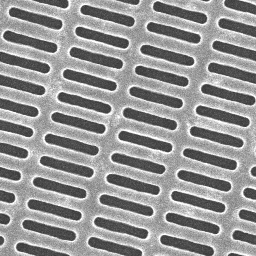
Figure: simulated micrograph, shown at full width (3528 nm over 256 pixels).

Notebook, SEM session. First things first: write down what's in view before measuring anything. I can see a regular array of holes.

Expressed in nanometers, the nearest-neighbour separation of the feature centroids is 303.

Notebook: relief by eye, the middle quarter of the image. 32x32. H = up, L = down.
HHHHHHHHHHLLLLLHHHHHHHHHHHHHHHHH
LLHHHHHHHHHHHHHHHHLLLLLLHHHHHHHH
LLLLLLHHHHHHHHHHHHLLLLLLLLLHHHHH
LLLLLLLLLHHHHHHHHHHHHLLLLLLLLLLH
HHHLLLLLLLLLLHHHHHHHHHHHHLLLLLLH
HHHHHHHLLLLLLHHHHHHHHHHHHHHHHLHH
HHHHHHHHHHHLLHHHLLLLLHHHHHHHHHHH
LHHHHHHHHHHHHHHHLLLLLLLLLHHHHHHH
LLLLLHHHHHHHHHHHHHLLLLLLLLLLLHHH
LLLLLLLLLHHHHHHHHHHHHHLLLLLLLLHH
HHHLLLLLLLLLHHHHHHHHHHHHHHLLLLHH
HHHHHHHLLLLLHHHLLLHHHHHHHHHHHHHH
HHHHHHHHHHHHHHHLLLLLLLHHHHHHHHHH
LLLLHHHHHHHHHHHLLLLLLLLLLLHHHHHH
LLLLLLLLHHHHHHHHHHHLLLLLLLLLHHHH
HHLLLLLLLLHHHHHHHHHHHHHLLLLLHHHH
HHHHHLLLLLHHHHHHHHHHHHHHHHLLHHHH
HHHHHHHHHLHHHHLLLLHHHHHHHHHHHHHH
LHHHHHHHHHHHHHLLLLLLLLHHHHHHHHHH
LLLLHHHHHHHHHHHHLLLLLLLLLHHHHHHH
LLLLLLLLHHHHHHHHHHHHLLLLLLLHHHHH
HHLLLLLLLHHHHHHHHHHHHHHLLLLHHHLL
HHHHHLLLHHHHLLLHHHHHHHHHHHHHHHLL
HHHHHHHHHHHHLLLLLLLHHHHHHHHHHHHL
LLHHHHHHHHHHLLLLLLLLLLHHHHHHHHHH
LLLLLHHHHHHHHHHHLLLLLLLLLHHHHHHH
LLLLLLLHHHHHHHHHHHHLLLLLLHHHHLLH
HHLLLLLHHHHLLHHHHHHHHHHLLHHHLLLL
HHHHHHHHHHHLLLLLLHHHHHHHHHHHHLLL
HHHHHHHHHHHLLLLLLLLLHHHHHHHHHHHL
LLHHHHHHHHHHHHLLLLLLLLLHHHHHHHHH
LLLLLHHHHHHHHHHHHLLLLLLLHHHHHHHH